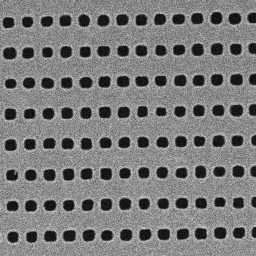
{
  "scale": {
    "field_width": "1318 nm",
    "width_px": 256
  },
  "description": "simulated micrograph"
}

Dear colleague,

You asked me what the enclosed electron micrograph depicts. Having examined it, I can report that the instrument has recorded a regular array of holes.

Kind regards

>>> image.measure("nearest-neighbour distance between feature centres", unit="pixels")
18.6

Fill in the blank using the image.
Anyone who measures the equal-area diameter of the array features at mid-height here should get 61.3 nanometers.